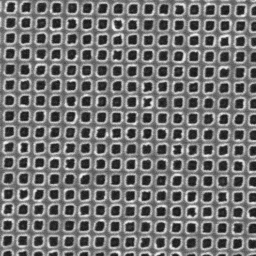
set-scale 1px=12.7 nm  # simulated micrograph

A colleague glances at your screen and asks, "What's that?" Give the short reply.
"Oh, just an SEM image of a regular array of holes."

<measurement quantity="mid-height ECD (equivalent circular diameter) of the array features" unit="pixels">10.5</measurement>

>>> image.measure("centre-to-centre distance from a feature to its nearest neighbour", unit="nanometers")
191